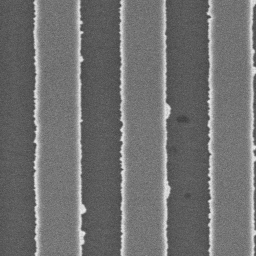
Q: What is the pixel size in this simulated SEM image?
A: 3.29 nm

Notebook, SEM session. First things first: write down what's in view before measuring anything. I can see lines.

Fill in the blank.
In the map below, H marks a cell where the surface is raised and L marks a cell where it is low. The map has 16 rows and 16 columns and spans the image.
LLHHHLLLHHLLLHHH
LLHHHLLLHHLLLHHH
LLHHHLLLHHLLLHHH
LLHHHLLLHHLLLHHH
LLHHHLLLHHLLLHHH
LLHHHLLLHHLLLHHH
LLHHHLLLHHLLLHHH
LLHHHLLLHHLLLHHH
LLHHHLLLHHLLLHHH
LLHHHLLLHHLLLHHH
LLHHHLLLHHLLLHHH
LLHHHLLLHHLLLHHH
LLHHHLLLHHLLLHHH
LLHHHLLLHHLLLHHH
LLHHHLLLHHLLLHHH
LLHHHLLLHHLLLHHH